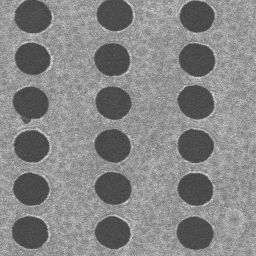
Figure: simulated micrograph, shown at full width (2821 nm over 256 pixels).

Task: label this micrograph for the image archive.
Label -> a regular array of holes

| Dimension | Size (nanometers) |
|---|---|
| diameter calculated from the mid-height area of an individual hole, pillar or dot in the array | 383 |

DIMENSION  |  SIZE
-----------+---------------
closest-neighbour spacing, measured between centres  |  475 nm